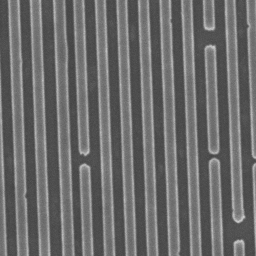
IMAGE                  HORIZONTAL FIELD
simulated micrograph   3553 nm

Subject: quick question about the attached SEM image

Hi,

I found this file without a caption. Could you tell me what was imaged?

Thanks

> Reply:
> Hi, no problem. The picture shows parallel lines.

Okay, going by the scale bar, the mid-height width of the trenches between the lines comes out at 12.1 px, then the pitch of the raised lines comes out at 300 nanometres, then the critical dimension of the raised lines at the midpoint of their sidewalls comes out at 9.62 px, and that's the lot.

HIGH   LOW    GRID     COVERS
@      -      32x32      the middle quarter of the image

@--@@----@@---@@---@@@---@@---@@
@--@@----@@---@@---@@@---@@---@@
@--@@----@@---@@---@@@---@@---@@
@--@@----@@---@@----@@---@@---@@
@--@@----@@---@@----@@---@@---@@
@--@@----@@---@@----@@---@@---@@
@--@@----@@---@@----@@---@@---@@
@--@@@---@@---@@----@@---@@----@
@--@@@---@@---@@----@@---@@----@
@--@@@---@@---@@----@@---@@----@
@--@@@---@@---@@----@@---@@----@
@---@@---@@---@@@---@@---@@----@
@---@@---@@---@@@---@@---@@----@
@---@@---@@---@@@---@@---@@----@
@---@@---@@---@@@---@@---@@----@
@---@@---@@----@@---@@---@@@---@
@---@@---@@----@@---@@---@@@---@
@---@@---@@----@@---@@---@@@---@
@---@@---@@----@@---@@---@@@---@
@---@@---@@----@@---@@---@@@---@
@---@@---@@----@@---@@---@@@---@
@---@@---@@----@@---@@---@@@---@
@@---@---@@@---@@---@@---@@@---@
@@-------@@@---@@---@@---@@@---@
@@-------@@@---@@---@@---@@@---@
@@--@@---@@@---@@---@@----@@---@
@@--@@---@@@---@@---@@@---@@---@
@@--@@----@@---@@---@@@---@@---@
@@--@@----@@---@@---@@@---@@---@
@@--@@----@@---@@---@@@---@@---@
@@--@@----@@---@@---@@@---@@---@
@@--@@----@@---@@----@@---@@---@